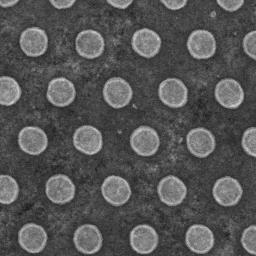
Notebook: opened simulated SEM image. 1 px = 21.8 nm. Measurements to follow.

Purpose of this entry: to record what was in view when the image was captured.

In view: a regular array of raised bodies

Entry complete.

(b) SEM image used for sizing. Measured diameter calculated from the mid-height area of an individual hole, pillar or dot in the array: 0.613 µm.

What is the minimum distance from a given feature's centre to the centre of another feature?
1.2 um